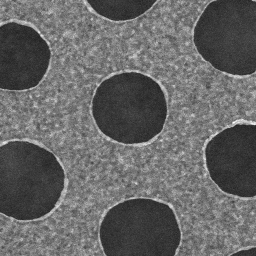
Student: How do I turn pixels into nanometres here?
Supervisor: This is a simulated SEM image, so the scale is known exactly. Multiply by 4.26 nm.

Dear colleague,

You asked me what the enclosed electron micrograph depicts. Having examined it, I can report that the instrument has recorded holes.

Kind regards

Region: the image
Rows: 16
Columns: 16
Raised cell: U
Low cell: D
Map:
UUUUUUDDDUUUUDDD
DUUUUUUUUUUUDDDD
DDDUUUUUUUUUDDDD
DDDUUUUUUUUUUDDD
DDDUUUUUUUUUUUDD
DDUUUUDDDDUUUUUU
UUUUUUDDDDUUUUUU
UUUUUUDDDDUUUUUU
UUUUUUUDDDUUUDDD
DDDUUUUUUUUUUDDD
DDDDUUUUUUUUUDDD
DDDDUUUUUUUUUUDD
DDDDUUUUDUUUUUUU
UDDUUUUDDDDUUUUU
UUUUUUDDDDDUUUUU
UUUUUUDDDDDUUUUU